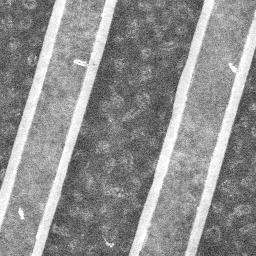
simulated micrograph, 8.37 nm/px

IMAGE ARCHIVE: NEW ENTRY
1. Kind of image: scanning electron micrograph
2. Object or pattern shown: one or a few lines or trenches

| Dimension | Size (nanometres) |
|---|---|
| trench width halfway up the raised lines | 790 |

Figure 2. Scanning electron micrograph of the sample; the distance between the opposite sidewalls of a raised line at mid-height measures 421 nanometers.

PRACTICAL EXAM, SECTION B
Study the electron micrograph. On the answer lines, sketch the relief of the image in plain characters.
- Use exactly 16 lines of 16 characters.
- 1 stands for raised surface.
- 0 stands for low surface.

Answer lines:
0000111000000111
0001111000000111
0001110000001111
0001110000001110
0001110000001110
0011100000011110
0011100000011110
0011100000011100
0111000000011100
0111000000111100
0111000000111000
1111000000111000
1110000000111000
1110000001111000
1110000001110000
1100000001110000